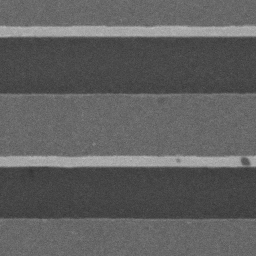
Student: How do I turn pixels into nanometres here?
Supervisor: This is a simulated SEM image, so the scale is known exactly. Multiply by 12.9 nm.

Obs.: lines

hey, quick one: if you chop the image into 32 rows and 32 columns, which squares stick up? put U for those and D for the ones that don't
UUUUUUUUUUUUUUUUUUUUUUUUUUUUUUUU
UUUUUUUUUUUUUUUUUUUUUUUUUUUUUUUU
UUUUUUUUUUUUUUUUUUUUUUUUUUUUUUUU
UUUUUUUUUUUUUUUUUUUUUUUUUUUUUUUU
UUDDUUDUDDDDDDDDDDDDDDDDDDDDDDDD
DDDDDDDDDDDDDDDDDDDDDDDDDDDDDDDD
DDDDDDDDDDDDDDDDDDDDDDDDDDDDDDDD
DDDDDDDDDDDDDDDDDDDDDDDDDDDDDDDD
DDDDDDDDDDDDDDDDDDDDDDDDDDDDDDDD
DDDDDDDDDDDDDDDDDDDDDDDDDDDDDDDD
DDDDDDDDDDDDDDDDDDDDDDDDDDDDDDDD
DDDDDDDDDDDDDDDDDDDDDDDDDDDDDDDD
UUUUUUUUUUUUUUUUUUUUUUUUUUUUUUUU
UUUUUUUUUUUUUUUUUUUUUUUUUUUUUUUU
UUUUUUUUUUUUUUUUUUUUUUUUUUUUUUUU
UUUUUUUUUUUUUUUUUUUUUUUUUUUUUUUU
UUUUUUUUUUUUUUUUUUUUUUUUUUUUUUUU
UUUUUUUUUUUUUUUUUUUUUUUUUUUUUUUU
UUUUUUUUUUUUUUUUUUUUUUUUUUUUUUUU
UUUUUUUUUUUUUUUUUUUUUUUUUUUUUUUU
UUUUUUUUUUUUUUUUUUUUUUUUUUUUUUUU
DDDDDDDDDDDDDDDDDDDDDDDDDDDDDDDD
DDDDDDDDDDDDDDDDDDDDDDDDDDDDDDDD
DDDDDDDDDDDDDDDDDDDDDDDDDDDDDDDD
DDDDDDDDDDDDDDDDDDDDDDDDDDDDDDDD
DDDDDDDDDDDDDDDDDDDDDDDDDDDDDDDD
DDDDDDDDDDDDDDDDDDDDDDDDDDDDDDDD
UUUUUUUUUUUUUUUUUUDDUUDDDDUUUUUU
UUUUUUUUUUUUUUUUUUUUUUUUUUUUUUUU
UUUUUUUUUUUUUUUUUUUUUUUUUUUUUUUU
UUUUUUUUUUUUUUUUUUUUUUUUUUUUUUUU
UUUUUUUUUUUUUUUUUUUUUUUUUUUUUUUU